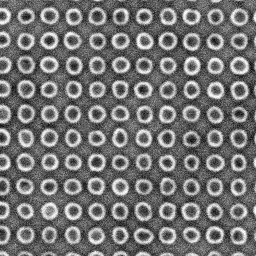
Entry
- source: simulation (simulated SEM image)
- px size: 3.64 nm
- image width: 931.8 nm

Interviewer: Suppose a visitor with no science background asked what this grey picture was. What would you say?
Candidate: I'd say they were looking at a regular array of raised bodies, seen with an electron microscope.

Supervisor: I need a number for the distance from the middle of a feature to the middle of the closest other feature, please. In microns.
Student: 0.085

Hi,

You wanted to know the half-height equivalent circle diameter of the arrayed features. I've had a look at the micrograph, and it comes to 55.4 nanometers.